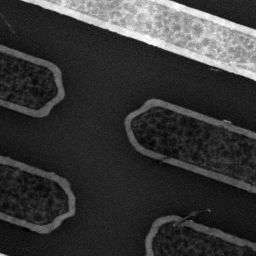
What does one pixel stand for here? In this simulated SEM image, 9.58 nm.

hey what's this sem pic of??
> one or a few lines or trenches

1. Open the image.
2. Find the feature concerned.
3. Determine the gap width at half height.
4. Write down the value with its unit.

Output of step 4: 529 nm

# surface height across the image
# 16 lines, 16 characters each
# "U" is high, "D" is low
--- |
DDDUUUUUUUUDDDDD
DDDDDDUUUUUUUUDD
DDDDDDDDDUUUUUUU
UDDDDDDDDDDDUUUU
UUUDDDDDDDDDDDDU
UUUUDDDDDDDDDDDD
UUUDDDDDDDDDDDDD
DDDDDDDDUUUUUDDD
DDDDDDDDUUUUUUUU
DDDDDDDDDUUUUUUU
UUDDDDDDDDDDUUUU
UUUUDDDDDDDDDDDU
UUUUDDDDDDDDDDDD
UUUUDDDDDDDDDDDD
DDDDDDDDDDUUUDDD
DDDDDDDDDUUUUUUU